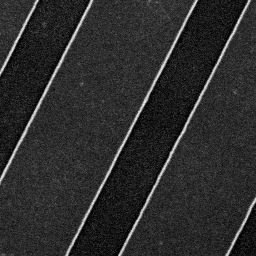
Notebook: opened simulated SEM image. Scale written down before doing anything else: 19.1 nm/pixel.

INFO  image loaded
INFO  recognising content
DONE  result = one or a few lines or trenches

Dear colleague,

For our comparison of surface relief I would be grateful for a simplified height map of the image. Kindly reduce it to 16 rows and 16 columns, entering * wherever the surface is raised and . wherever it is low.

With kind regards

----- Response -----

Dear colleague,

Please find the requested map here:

**....******...*
**...******....*
*...*******...**
*...*******...**
...*******...***
...******....***
..*******...****
..******....****
.*******...*****
.******....*****
*******...******
******....******
******...*******
*****....******.
*****...*******.
****....******..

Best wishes